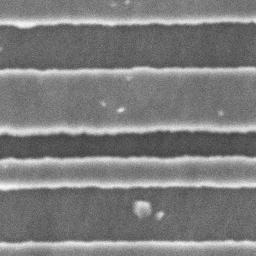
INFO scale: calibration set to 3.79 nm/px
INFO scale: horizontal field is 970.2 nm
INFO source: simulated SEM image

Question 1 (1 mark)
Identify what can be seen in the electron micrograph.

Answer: lines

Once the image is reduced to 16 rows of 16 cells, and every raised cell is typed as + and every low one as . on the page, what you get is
++++++++++++++++
+++...++........
................
................
++++++++++++++++
++++++++++++++++
++++++++++++++++
++++++++++++++++
................
................
++++++++++++++++
++++++++++++++++
................
................
................
++++++++++++++++